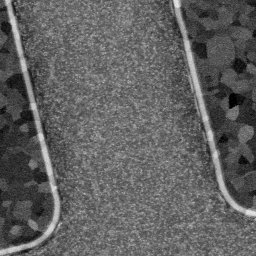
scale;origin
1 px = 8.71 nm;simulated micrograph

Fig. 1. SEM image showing one or a few lines or trenches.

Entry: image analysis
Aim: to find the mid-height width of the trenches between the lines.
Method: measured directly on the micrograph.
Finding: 1420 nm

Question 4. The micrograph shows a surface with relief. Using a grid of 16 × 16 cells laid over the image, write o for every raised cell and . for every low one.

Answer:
o..........ooooo
o..........ooooo
o...........oooo
o...........oooo
oo..........oooo
oo..........oooo
oo...........ooo
oo...........ooo
ooo..........ooo
ooo..........ooo
ooo...........oo
ooo...........oo
oooo..........oo
ooo.............
ooo.............
o...............